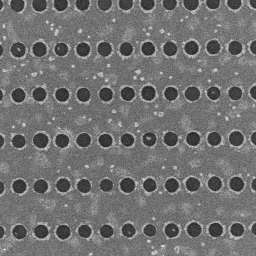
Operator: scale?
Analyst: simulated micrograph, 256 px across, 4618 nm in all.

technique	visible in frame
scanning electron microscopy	a regular array of holes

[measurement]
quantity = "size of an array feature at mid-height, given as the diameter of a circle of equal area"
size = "262 nm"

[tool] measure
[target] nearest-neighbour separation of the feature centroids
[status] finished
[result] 387 nm